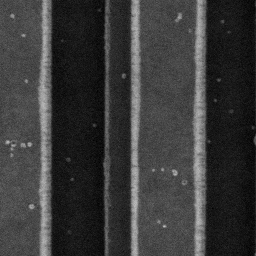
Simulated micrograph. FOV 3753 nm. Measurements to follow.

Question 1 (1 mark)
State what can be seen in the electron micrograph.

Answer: lines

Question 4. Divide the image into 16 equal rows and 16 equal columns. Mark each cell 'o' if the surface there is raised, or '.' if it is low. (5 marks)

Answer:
ooo.....ooooo...
ooo.....ooooo...
ooo.....ooooo...
ooo.....ooooo...
ooo.....ooooo...
ooo.....ooooo...
ooo.....ooooo...
ooo.....ooooo...
ooo.....ooooo...
ooo.....ooooo...
ooo.....ooooo...
ooo.....ooooo...
ooo.....ooooo...
ooo.....ooooo...
ooo.....ooooo...
ooo.....ooooo...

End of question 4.